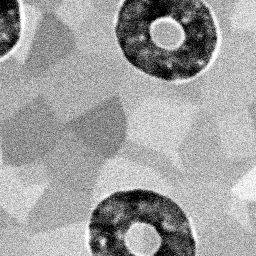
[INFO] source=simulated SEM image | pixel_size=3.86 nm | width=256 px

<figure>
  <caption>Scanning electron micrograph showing ring-shaped grooves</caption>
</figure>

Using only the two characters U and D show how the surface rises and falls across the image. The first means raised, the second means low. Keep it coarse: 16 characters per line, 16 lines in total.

DUUUUUUDDDDDDUUU
DUUUUUUDDDUDDDUU
DUUUUUUDDDUDDDUU
UUUUUUUUDDDDDUUU
UUUUUUUUUDDDDUUU
UUUUUUUUUUUUUUUU
UUUUUUUUUUUUUUUU
UUUUUUUUUUUUUUUU
UUUUUUUUUUUUUUUU
UUUUUUUUUUUUUUUU
UUUUUUUUUUUUUUUU
UUUUUUUUUUUUUUUU
UUUUUUDDDDDUUUUU
UUUUUUDDDDDDUUUU
UUUUUDDDUUDDUUUU
UUUUUUDDUUDDUUUU